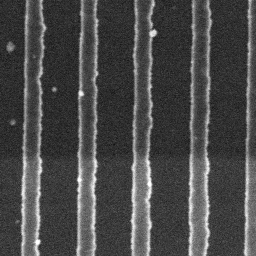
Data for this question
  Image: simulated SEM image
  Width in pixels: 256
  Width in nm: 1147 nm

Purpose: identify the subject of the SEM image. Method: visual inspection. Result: lines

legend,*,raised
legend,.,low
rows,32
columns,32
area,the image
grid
...**.....**.....**.....**.....*
...**.....**.....**.....**.....*
...**.....**.....**.....**.....*
...***....**.....**.....**.....*
...**.....**.....**.....**.....*
...**.....**.....**.....**.....*
...**.....**.....**.....**.....*
...**.....**.....**.....**.....*
...**.....**.....**.....**.....*
...**.....**.....**.....**.....*
...**.....**.....**.....**.....*
...**.....**.....**.....**.....*
...**.....**.....**.....**.....*
...**.....**.....**.....**.....*
...**.....**.....**.....**.....*
...**.....**.....**.....**.....*
...**.....**.....**.....**.....*
...**.....**.....**.....**.....*
...**.....**.....**.....**.....*
...**.....**.....**.....**.....*
...**.....**.....**.....**.....*
...**.....**.....**.....**.....*
...**.....**.....**.....**.....*
...**.....**.....**.....**.....*
...**.....**.....**.....**.....*
...**.....**.....**.....**.....*
...**.....**.....**.....**.....*
...**.....**....***.....**.....*
...**.....**.....**.....**.....*
...**.....**.....**.....**.....*
...**.....**....***.....**.....*
...**.....**.....**.....**.....*